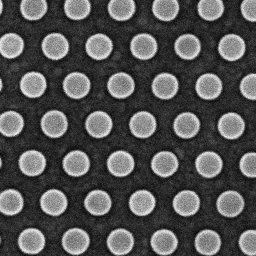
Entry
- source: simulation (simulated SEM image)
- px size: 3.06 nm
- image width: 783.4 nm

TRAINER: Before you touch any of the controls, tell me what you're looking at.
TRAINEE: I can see a regular array of raised bodies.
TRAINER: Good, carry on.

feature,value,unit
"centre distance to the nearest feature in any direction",44.1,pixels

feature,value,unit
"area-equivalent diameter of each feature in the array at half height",80.4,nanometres